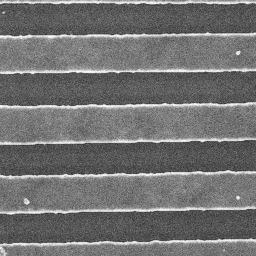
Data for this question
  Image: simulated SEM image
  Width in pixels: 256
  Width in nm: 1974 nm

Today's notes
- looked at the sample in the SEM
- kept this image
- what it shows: lines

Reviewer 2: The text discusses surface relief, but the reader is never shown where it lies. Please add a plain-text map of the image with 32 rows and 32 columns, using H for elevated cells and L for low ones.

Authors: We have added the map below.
LLLLLLLLLLLLLLLLLLLLLLLLLLLLLLLL
LLLLLLLLLLLLLLLLLLLLLLLLLLLLLLLL
LLLLLLLLLLLLLLLLLLLLLLLLLLLLLLLL
LLLLLLLLLLLLLLLLLLLLLLLLLLLLLLLL
LLLLLLLHHLLHHHHHHHHHHHHHHHHHHHHH
HHHHHHHHHHHHHHHHHHHHHHHHHHHHHHHH
HHHHHHHHHHHHHHHHHHHHHHHHHHHHHHHH
HHHHHHHHHHHHHHHHHHHHHHHHHHHHHHHH
HHHHHHHHHHHHHHHHHHHHHHHHHHHHHHHH
LLLLLLLLLLLLLLLLLLLLLLLLLLLLLLLL
LLLLLLLLLLLLLLLLLLLLLLLLLLLLLLLL
LLLLLLLLLLLLLLLLLLLLLLLLLLLLLLLL
LLLLLLLLLLLLLLLLLLLLLLLLLLLLLLLL
HHHHHHHHHHHHHHHHHHHHHHHHHHHHHHHH
HHHHHHHHHHHHHHHHHHHHHHHHHHHHHHHH
HHHHHHHHHHHHHHHHHHHHHHHHHHHHHHHH
HHHHHHHHHHHHHHHHHHHHHHHHHHHHHHHH
HHHHHHHHHHHHHHHHHHHHHHHHHHHHHHHL
LLLLLLLLLLLLLLLLLLLLLLLLLLLLLLLL
LLLLLLLLLLLLLLLLLLLLLLLLLLLLLLLL
LLLLLLLLLLLLLLLLLLLLLLLLLLLLLLLL
LLLLLLLLLLLLLLLLLLLLLLLLHHLHHHHH
HHHHHHHHHHHHHHHHHHHHHHHHHHHHHHHH
HHHHHHHHHHHHHHHHHHHHHHHHHHHHHHHH
HHHHHHHHHHHHHHHHHHHHHHHHHHHHHHHH
HHHHHHHHHHHHHHHHHHHHHHHHHHHHHHHH
HHHHHHHHHLLLLLLLLLLLLLLLLLLLLLLL
LLLLLLLLLLLLLLLLLLLLLLLLLLLLLLLL
LLLLLLLLLLLLLLLLLLLLLLLLLLLLLLLL
LLLLLLLLLLLLLLLLLLLLLLLLLLLLLLLL
LHHHHHHHHHHHHHHHHHHHHHHHHHHHHHHH
HHHHHHHHHHHHHHHHHHHHHHHHHHHHHHHH